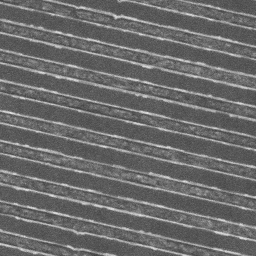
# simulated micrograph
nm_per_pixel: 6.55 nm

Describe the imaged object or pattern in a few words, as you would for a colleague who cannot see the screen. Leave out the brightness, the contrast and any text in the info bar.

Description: parallel lines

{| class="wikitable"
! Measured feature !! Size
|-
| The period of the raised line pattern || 193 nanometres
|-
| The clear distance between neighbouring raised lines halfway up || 10.9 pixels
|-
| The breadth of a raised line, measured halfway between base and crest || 0.117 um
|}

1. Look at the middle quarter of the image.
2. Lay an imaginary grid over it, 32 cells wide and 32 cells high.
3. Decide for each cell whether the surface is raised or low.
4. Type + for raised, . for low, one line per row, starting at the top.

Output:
.+++++++++++++++++++++..........
......++++++++++++++++++++......
..........++++++++++++++++++++..
+..............+++++++++++++++++
++++++.............+++++++++++++
++++++++++..............++++++++
++++++++++++++..............++++
++++++++++++++++++++............
...+++++++++++++++++++++........
........+++++++++++++++++++++...
............++++++++++++++++++++
++++.............+++++++++++++++
++++++++......++.....+++++++++++
+++++++++++++............+++++++
+++++++++++++++++.............++
++++++++++++++++++++++..........
.....+++++++++++++++++++++......
.........++++++++++++++++++++++.
+.............++++++++++++++++++
++++++............++++++++++++++
++++++++++.............+++++++++
+++++++++++++++.............++++
+++++++++++++++++++.............
..++++++++++++++++++++++........
.......+++++++++++++++++++++....
............++++++++++++++++++++
+++..............+++++++++++++++
+++++++..............+++++++++++
++++++++++++.......++.....++++++
++++++++++++++++....+.........++
.++++++++++++++++++++...........
.....++++++++++++++++++++.......